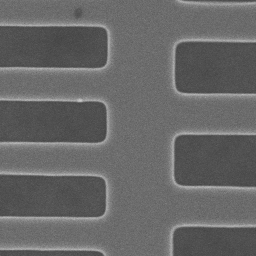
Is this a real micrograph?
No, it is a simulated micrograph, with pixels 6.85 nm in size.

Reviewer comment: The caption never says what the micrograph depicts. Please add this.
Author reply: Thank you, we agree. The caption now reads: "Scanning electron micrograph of groups of lines, slits or small figures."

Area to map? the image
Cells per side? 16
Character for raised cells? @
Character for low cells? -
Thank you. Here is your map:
@@@@@@@@@@@@@@@@
@@@@@@@@@@@@@@@@
-------@@@@@@@@@
-------@@@@-----
@@@@@@@@@@@-----
@@@@@@@@@@@-----
------@@@@@@@@@@
-------@@@@@@@@@
-------@@@@-----
@@@@@@@@@@@-----
@@@@@@@@@@@-----
-------@@@@-----
-------@@@@@@@@@
------@@@@@@@@@@
@@@@@@@@@@@-----
@@@@@@@@@@@-----